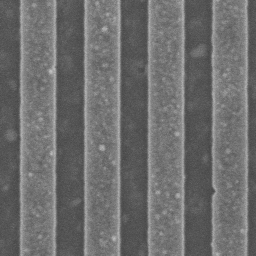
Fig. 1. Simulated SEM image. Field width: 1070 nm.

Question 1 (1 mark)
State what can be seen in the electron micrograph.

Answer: one or a few lines or trenches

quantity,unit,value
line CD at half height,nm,145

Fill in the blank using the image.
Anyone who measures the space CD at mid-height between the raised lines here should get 121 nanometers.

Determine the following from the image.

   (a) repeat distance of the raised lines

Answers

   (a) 268 nanometres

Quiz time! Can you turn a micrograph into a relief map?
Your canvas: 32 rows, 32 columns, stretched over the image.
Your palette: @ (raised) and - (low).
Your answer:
---@@@@----@@@@----@@@@----@@@@-
---@@@@----@@@@----@@@@----@@@@-
---@@@@----@@@@----@@@@----@@@@-
---@@@@----@@@@----@@@@----@@@@-
---@@@@----@@@@----@@@@----@@@@-
---@@@@----@@@@----@@@@----@@@@-
---@@@@----@@@@----@@@@----@@@@-
---@@@@----@@@@----@@@@----@@@@-
---@@@@----@@@@----@@@@----@@@@-
---@@@@----@@@@----@@@@----@@@@-
---@@@@----@@@@----@@@@----@@@@-
---@@@@----@@@@----@@@@----@@@@-
---@@@@----@@@@----@@@@----@@@@-
---@@@@----@@@@----@@@@----@@@@-
---@@@@----@@@@----@@@@----@@@@-
---@@@@----@@@@----@@@@----@@@@-
---@@@@----@@@@----@@@@----@@@@-
---@@@@----@@@@----@@@@----@@@@-
---@@@@----@@@@----@@@@----@@@@-
---@@@@----@@@@----@@@@----@@@@-
---@@@@----@@@@----@@@@----@@@@-
---@@@@----@@@@----@@@@----@@@@-
---@@@@----@@@@----@@@@----@@@@-
---@@@@----@@@@----@@@@----@@@@-
---@@@@----@@@@----@@@@----@@@@-
---@@@@----@@@@----@@@@----@@@@-
---@@@@----@@@@----@@@@----@@@@-
---@@@@----@@@@----@@@@----@@@@-
---@@@@----@@@@----@@@@----@@@@-
---@@@@----@@@@----@@@@----@@@@-
---@@@@----@@@@----@@@@----@@@@-
---@@@@----@@@@----@@@@----@@@@-